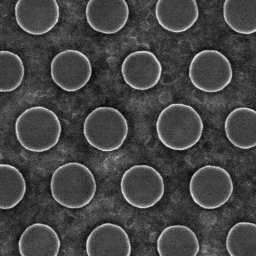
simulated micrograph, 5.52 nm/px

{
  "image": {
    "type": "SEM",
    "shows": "a regular array of raised bodies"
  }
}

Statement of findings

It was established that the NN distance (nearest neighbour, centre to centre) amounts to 365 nanometers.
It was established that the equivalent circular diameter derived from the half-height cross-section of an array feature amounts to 233 nanometers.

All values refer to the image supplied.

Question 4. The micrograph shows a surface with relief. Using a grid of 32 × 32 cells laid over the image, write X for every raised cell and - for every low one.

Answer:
--XXXXX----XXXXX----XXXXX---XXXX
--XXXXX----XXXXX----XXXXX---XXXX
--XXXXX----XXXXX----XXXX----XXXX
---XXX------XXX------XX------XXX
--------------------------------
--------------------------------
X-------XX-------XX------XX-----
XXX----XXXX-----XXXX----XXXX----
XXX---XXXXX----XXXXX----XXXXX---
XXX---XXXXX----XXXXX----XXXXX---
XX-----XXXX-----XXX-----XXXX----
--------------------------------
--------------------------------
----X-------XX-------XXX--------
---XXXX----XXXX-----XXXXX----XXX
--XXXXX----XXXXX----XXXXX---XXXX
--XXXXXX---XXXXX----XXXXX---XXXX
--XXXXX----XXXX-----XXXXX----XXX
---XXX------XXX------XX---------
--------------------------------
--------XX----------------------
XX-----XXXX-----XXXX-----XXX----
XXX----XXXXX---XXXXX----XXXXX---
XXX---XXXXXX---XXXXX----XXXXX---
XXX----XXXXX----XXXX----XXXXX---
XX------XXX-----XXX------XXX----
--------------------------------
-------------------------X------
----XX------XXX------XX------XXX
---XXXX----XXXXX----XXXX----XXXX
--XXXXX----XXXXX----XXXXX---XXXX
---XXXX----XXXXX----XXXXX----XXX